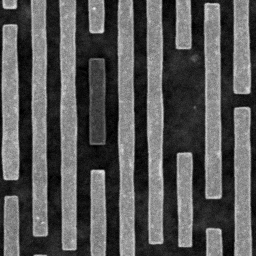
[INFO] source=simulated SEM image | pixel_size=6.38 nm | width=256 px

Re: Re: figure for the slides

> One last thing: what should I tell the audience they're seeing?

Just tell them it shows wiring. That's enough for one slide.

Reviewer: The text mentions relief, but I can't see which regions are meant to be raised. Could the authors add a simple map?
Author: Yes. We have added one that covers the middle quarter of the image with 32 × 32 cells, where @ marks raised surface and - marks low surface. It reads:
@@@---@@@@----@@@----@@@--------
@@@---@@@@----@@@----@@@--------
@@@---@@@@----@@@----@@@--------
@@@---@@@@----@@@----@@@--------
@@@---@@@@----@@@----@@@--------
@@@---@@@@----@@@----@@@--------
@@@---@@@@----@@@----@@@--------
@@@---@@@@----@@@----@@@--------
@@@---@@@@----@@@----@@@@-------
@@@----@@@----@@@----@@@@-------
@@@---@@@@----@@@----@@@@-------
@@@---@@@@----@@@----@@@@-------
@@@---@@@@----@@@----@@@@-------
@@@---@@@@----@@@----@@@@-------
@@@---@@@@----@@@----@@@@-------
@@@---@@@@----@@@----@@@@-------
@@@---@@@@----@@@----@@@@-------
@@@---@@@@----@@@----@@@@-------
@@@---@@@@----@@@----@@@@-------
@@@---@@@@----@@@----@@@@-------
@@@-----------@@@----@@@--------
@@@-----------@@@----@@@--------
@@@-----------@@@----@@@----@@@@
@@@-----------@@@----@@@----@@@@
@@@-----------@@@----@@@----@@@@
@@@-----------@@@----@@@----@@@@
@@@-----------@@@----@@@@---@@@@
@@@----@@@----@@@----@@@@---@@@@
@@@----@@@----@@@----@@@@---@@@@
@@@----@@@----@@@----@@@@---@@@@
@@@----@@@----@@@----@@@@---@@@@
@@@----@@@----@@@----@@@@---@@@@